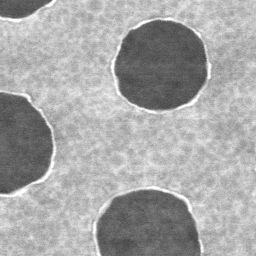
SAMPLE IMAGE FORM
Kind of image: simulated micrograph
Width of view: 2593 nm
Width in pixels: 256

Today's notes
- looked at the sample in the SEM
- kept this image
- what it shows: holes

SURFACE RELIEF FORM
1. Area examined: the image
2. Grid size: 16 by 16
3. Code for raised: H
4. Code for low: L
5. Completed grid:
LLLHHHHHHHHHHHHH
HHHHHHHHHLLHHHHH
HHHHHHHHLLLLLHHH
HHHHHHHLLLLLLHHH
HHHHHHHLLLLLLHHH
HHHHHHHLLLLLLHHH
LLHHHHHHLLLLHHHH
LLLHHHHHHHHHHHHH
LLLHHHHHHHHHHHHH
LLLHHHHHHHHHHHHH
LLLHHHHHHHHHHHHH
LLHHHHHHHHHHHHHH
HHHHHHHLLLLHHHHH
HHHHHHLLLLLLHHHH
HHHHHHLLLLLLHHHH
HHHHHHLLLLLLLHHH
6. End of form